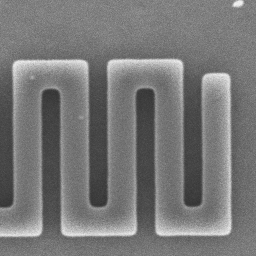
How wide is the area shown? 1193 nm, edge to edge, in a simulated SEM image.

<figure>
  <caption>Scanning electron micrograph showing groups of lines, slits or small figures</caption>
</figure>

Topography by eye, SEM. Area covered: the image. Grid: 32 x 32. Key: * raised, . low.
................................
................................
................................
................................
................................
................................
................................
...............**.****..........
..*********...*********.........
..*********...*********...**....
..*********...*********..****...
..***..****...***..****..****...
..***...***...***..****..****...
..***...***...***..****..****...
..***...***...***..****..****...
..***...***...***..****..****...
..***...***...***..****..****...
..***...***...***..****..****...
..***...***...***..****..****...
..***...***...***..****..****...
..***...***...***..****..****...
..***...***...***..****..****...
..***...***...***..****..****...
..***...***...***..****..****...
..***...***...***...***..****...
..***...***..****...***..****...
*****...*********...*********...
*****...*********...*********...
*****...*********...*********...
................................
................................
................................